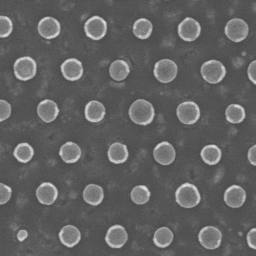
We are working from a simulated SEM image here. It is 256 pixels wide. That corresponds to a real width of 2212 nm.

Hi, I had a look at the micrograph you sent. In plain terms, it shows a regular array of raised bodies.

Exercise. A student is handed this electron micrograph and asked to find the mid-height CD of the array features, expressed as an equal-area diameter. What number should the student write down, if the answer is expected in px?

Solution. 21.7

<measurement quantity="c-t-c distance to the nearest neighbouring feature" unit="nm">403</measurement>